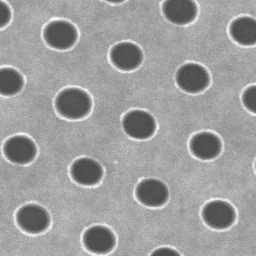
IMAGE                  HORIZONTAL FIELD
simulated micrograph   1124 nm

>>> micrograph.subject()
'a regular array of holes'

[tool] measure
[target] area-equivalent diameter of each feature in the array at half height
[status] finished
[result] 0.128 µm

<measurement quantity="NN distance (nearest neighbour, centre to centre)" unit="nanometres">303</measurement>